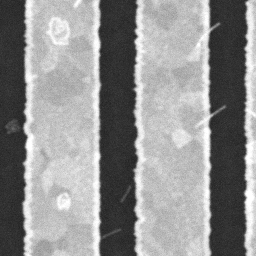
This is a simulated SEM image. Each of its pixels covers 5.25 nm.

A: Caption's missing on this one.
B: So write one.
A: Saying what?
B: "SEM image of lines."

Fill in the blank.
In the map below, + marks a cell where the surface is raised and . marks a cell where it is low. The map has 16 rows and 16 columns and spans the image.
..++++...++++..+
..++++...++++..+
..++++...++++..+
..++++...++++..+
..++++...++++..+
..++++...++++..+
..++++...++++..+
..++++...++++..+
..++++...++++..+
..++++...++++..+
..++++...++++..+
..++++...++++..+
..++++...++++..+
..++++...++++..+
..++++...++++..+
..++++...++++..+